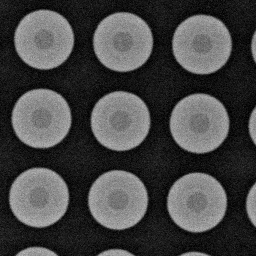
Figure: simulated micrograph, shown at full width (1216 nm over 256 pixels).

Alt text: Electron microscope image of an array of small figures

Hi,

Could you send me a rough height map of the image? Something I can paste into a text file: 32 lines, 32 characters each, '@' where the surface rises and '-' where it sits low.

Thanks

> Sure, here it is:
--------------------------------
----@@@-------------------------
---@@@@@-----@@@@@-----@@@@-----
--@@@@@@@---@@@@@@@---@@@@@@----
--@@@@@@@---@@@@@@@---@@@@@@@---
--@@@@@@@---@@@@@@@---@@@@@@@--@
--@@@@@@@---@@@@@@@---@@@@@@@--@
---@@@@@----@@@@@@----@@@@@@----
----@@@-------@@@------@@@@@----
--------------------------------
--------------------------------
---@@@@-------@@----------------
--@@@@@@----@@@@@@-----@@@@-----
--@@@@@@@---@@@@@@----@@@@@@----
--@@@@@@@--@@@@@@@@--@@@@@@@@--@
--@@@@@@@--@@@@@@@@--@@@@@@@@--@
--@@@@@@----@@@@@@@--@@@@@@@---@
---@@@@@----@@@@@@----@@@@@@----
--------------@@@------@@@@-----
--------------------------------
--------------------------------
---@@@@------@@@----------------
--@@@@@@----@@@@@@----@@@@@-----
-@@@@@@@---@@@@@@@---@@@@@@@---@
-@@@@@@@@--@@@@@@@---@@@@@@@---@
-@@@@@@@@--@@@@@@@---@@@@@@@---@
--@@@@@@---@@@@@@@---@@@@@@@---@
--@@@@@-----@@@@@@----@@@@@@---@
--------------@@-------@@@------
--------------------------------
--------------------------------
--@@@@@------@@@--------@-------